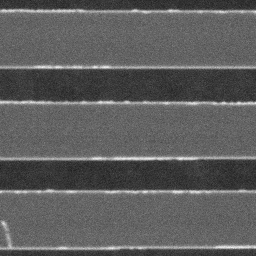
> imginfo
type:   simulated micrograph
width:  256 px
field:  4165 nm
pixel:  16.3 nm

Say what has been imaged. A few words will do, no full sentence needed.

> lines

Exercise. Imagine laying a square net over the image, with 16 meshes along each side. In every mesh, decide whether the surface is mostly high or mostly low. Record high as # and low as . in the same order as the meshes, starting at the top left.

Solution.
................
################
################
################
................
................
################
################
################
################
................
................
################
################
################
#########.......